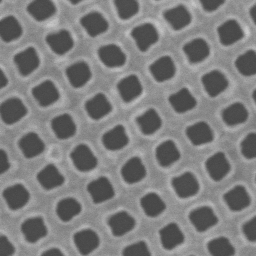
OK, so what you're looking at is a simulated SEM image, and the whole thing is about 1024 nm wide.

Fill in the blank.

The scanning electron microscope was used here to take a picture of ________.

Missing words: a regular array of holes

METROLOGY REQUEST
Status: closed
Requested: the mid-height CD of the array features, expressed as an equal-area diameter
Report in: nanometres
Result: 105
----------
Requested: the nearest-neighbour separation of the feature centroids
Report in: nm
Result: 148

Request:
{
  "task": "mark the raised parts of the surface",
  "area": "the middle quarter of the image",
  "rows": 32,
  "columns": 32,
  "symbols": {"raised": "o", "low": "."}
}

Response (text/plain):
o.....oooo.....oooooo.......oooo
.......oooooooooooooo.......oooo
.......ooooooooooooooo......oooo
o......oooooooo....ooo.....ooooo
o.....ooooooo......oooo..ooooooo
oo...oooooooo......ooooooooooooo
ooooooooooooo.......ooooooooo..o
oooooooo..oooo.....oooooooo.....
ooooooo....ooo....oooooooo......
ooooo.......ooo..ooooooooo......
ooooo.......ooooooooooooooo.....
ooooo.......oooooooo...oooo.....
.ooooo.....ooooooooo....oooooooo
..ooooo..ooooooooo......oooooooo
...ooooooooooooooo.......ooooooo
...oooooooooo..oooo......oooooo.
...oooooooo....oooo.....oooooo..
...ooooooo.....oooo...oooooooo..
..ooooooo.......ooooooooooooooo.
ooooooooo.......oooooooo....oooo
ooo...oooo.....oooooooo.....oooo
oo.....oooo...ooooooooo......ooo
o......oooooooooooooooo......ooo
oo......ooooooooo..oooo......ooo
oo......ooooooo....oooo.....oooo
ooo.....ooooooo.....oooo...ooooo
oooo...ooooooo.......ooooooooooo
oooooooooooooo.......oooooooo...
ooooooooo..oooo.....ooooooo.....
ooooooo....oooo....oooooooo.....
oooooo......ooooooooooooooo.....
oooooo......ooooooooooooooo.....